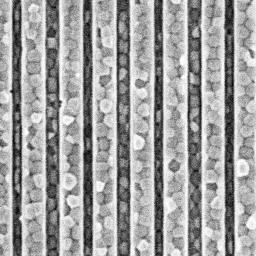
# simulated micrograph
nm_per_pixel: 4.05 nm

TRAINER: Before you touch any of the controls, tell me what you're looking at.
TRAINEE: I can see parallel lines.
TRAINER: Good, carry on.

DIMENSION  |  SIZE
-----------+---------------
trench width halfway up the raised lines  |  45.6 nanometres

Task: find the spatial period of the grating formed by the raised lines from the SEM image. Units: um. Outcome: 0.145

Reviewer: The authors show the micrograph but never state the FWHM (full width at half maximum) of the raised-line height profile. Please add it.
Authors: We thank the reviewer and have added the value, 90.7 nm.